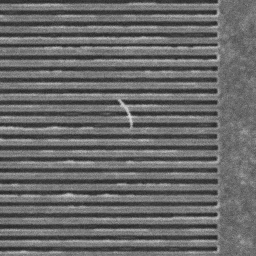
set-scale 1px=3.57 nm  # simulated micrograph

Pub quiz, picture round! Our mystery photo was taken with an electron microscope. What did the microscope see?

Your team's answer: parallel lines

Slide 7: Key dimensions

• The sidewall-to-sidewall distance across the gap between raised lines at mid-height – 18.3 nm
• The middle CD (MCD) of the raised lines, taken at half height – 21.4 nm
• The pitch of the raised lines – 40.1 nm